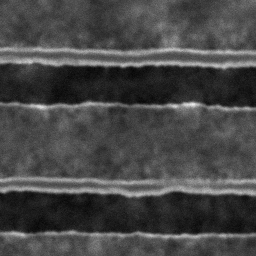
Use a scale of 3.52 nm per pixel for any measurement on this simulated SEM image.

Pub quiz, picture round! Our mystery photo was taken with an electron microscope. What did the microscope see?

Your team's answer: lines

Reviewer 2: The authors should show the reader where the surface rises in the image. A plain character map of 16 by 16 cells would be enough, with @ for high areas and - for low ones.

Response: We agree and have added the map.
@@@@@@@@@@@@@@@@
@@@@@@@@@@@@@@@@
@@@@@@@@@@@@@@@@
@@@@@@@@@@@@@@@@
----------------
----------------
@----@@---------
@@@@@@@@@@@@@@@@
@@@@@@@@@@@@@@@@
@@@@@@@@@@@@@@@@
@@@@@@@@@@@@@@@@
@@@@@@@@@@@@@@@@
----------------
----------------
----------------
@@@@@@@@@@@@@@@@